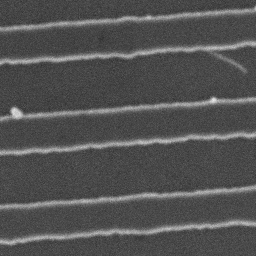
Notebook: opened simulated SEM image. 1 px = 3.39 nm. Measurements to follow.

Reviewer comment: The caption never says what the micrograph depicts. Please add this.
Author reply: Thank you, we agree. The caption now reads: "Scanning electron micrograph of lines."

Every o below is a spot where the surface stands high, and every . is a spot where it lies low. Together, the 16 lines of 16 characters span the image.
................
...ooooooooooooo
oooooooooooooooo
oooooooo........
................
................
...........ooooo
oooooooooooooooo
oooooooooooooooo
ooo.............
................
................
......oooooooooo
oooooooooooooooo
oooooooooo......
................